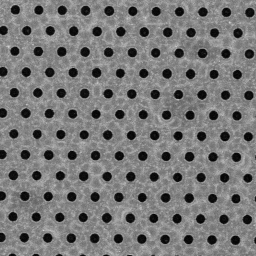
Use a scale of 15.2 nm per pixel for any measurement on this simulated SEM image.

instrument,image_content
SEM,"a regular array of holes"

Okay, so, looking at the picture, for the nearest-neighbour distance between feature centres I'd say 0.355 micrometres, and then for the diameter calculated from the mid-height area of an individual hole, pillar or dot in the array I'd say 151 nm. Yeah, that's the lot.